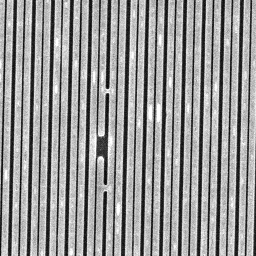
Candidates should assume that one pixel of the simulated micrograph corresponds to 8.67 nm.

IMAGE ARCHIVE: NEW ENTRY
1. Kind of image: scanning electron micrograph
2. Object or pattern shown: parallel lines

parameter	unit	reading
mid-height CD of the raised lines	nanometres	55.3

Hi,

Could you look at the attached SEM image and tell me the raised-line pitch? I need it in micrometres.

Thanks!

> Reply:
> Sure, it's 0.0821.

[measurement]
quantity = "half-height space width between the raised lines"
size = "31.4 nm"